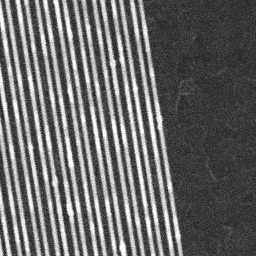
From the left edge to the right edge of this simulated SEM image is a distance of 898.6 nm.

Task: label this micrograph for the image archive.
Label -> parallel lines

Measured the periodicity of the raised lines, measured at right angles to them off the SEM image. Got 32.9 nm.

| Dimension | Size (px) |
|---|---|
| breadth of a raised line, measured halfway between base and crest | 3.82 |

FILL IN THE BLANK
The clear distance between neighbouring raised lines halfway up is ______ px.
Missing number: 5.67